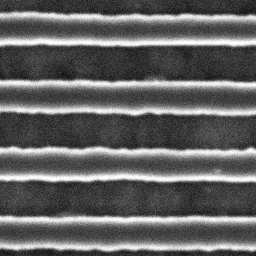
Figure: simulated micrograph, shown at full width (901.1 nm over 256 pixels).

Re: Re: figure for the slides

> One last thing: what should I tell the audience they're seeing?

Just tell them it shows lines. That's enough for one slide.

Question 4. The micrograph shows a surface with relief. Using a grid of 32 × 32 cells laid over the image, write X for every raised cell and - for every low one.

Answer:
--------------------------------
--------------------------------
XXXXXXXXXXXXXXXXXXXXXXXXXXXXXXXX
XXXXXXXXXXXXXXXXXXXXXXXXXXXXXXXX
XXXXXXXXXXXXXXXXXXXXXXXXXXXXXXXX
X-X----XX--XXXXXXXXXXXXXXXXXXXXX
--------------------------------
--------------------------------
--------------------------------
--------------------------------
XXXXXXXXXXXXXXXXXXXXXXXXXXXXXXXX
XXXXXXXXXXXXXXXXXXXXXXXXXXXXXXXX
XXXXXXXXXXXXXXXXXXXXXXXXXXXXXXXX
XXXXXXXXXXXXXXXXXXXXXXXXXXXXXXXX
--------------------------------
--------------------------------
--------------------------------
--------------------------------
-X----X-----X-------------------
XXXXXXXXXXXXXXXXXXXXXXXXXXXXXXXX
XXXXXXXXXXXXXXXXXXXXXXXXXXXXXXXX
XXXXXXXXXXXXXXXXXXXXXXXXXXXXXXXX
--------------------X-------XXX-
--------------------------------
--------------------------------
--------------------------------
--------------------------------
XXXXXXXXXXXXXXXXXXXXXXXXXXXXXXXX
XXXXXXXXXXXXXXXXXXXXXXXXXXXXXXXX
XXXXXXXXXXXXXXXXXXXXXXXXXXXXXXXX
XXXXXXXXXXXXXXXXXXXXXXXXXXXXXXXX
--------------------------------